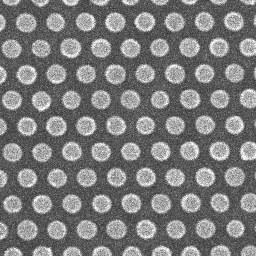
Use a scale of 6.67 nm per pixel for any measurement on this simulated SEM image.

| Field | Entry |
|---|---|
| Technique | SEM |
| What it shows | a regular array of raised bodies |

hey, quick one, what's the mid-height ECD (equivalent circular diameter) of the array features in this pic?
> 17.7 pixels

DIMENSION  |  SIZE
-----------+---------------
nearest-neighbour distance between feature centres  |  196 nm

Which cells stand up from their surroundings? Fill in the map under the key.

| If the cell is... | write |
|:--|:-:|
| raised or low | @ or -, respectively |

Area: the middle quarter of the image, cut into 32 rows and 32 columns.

------------@@-----@@------@@---
----@@@----@@@@---@@@@----@@@@--
---@@@@@---@@@@---@@@@----@@@@--
----@@@----@@@@---@@@@----@@@@--
-----@------@@-------------@@---
--------------------------------
--------------------------------
@@@-----@@@----@@@----@@@----@@@
@@@@---@@@@---@@@@@---@@@@---@@@
@@@@---@@@@---@@@@@---@@@@---@@@
@@@-----@@@----@@@-----@@-----@@
--------------------------------
--------------------------------
-----@------@@-----@@------@----
----@@@----@@@@---@@@@----@@@@--
---@@@@@---@@@@---@@@@----@@@@--
----@@@@---@@@@----@@@----@@@@--
-----@@-----@@------------------
--------------------------------
--------------------------------
@@@@----@@@----@@@----@@@@----@@
@@@@---@@@@----@@@@---@@@@---@@@
@@@@---@@@@----@@@@---@@@@---@@@
@@@-----@@@----@@@-----@@-----@@
--------------------------------
--------------------------------
------------@@-----@@@-----@----
----@@@@---@@@@----@@@@---@@@@--
----@@@@---@@@@---@@@@@---@@@@--
----@@@@---@@@@----@@@@---@@@@--
--------------------------------
--------------------------------